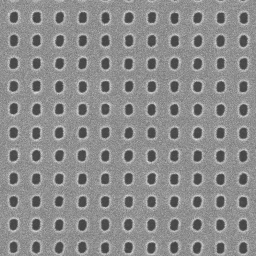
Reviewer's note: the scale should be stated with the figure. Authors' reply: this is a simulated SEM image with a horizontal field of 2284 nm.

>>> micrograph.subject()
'a regular array of holes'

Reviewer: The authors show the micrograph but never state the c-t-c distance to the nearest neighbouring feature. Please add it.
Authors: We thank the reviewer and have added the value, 202 nm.